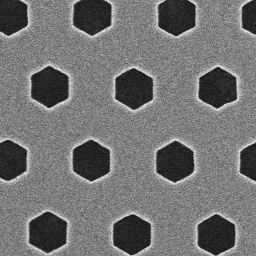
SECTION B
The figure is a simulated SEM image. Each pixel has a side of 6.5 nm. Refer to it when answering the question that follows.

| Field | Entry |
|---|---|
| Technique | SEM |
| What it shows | holes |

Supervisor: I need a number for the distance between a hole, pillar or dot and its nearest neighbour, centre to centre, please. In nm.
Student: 545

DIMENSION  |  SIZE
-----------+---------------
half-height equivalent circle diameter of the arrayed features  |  255 nanometres